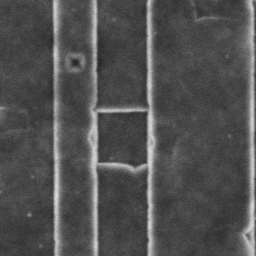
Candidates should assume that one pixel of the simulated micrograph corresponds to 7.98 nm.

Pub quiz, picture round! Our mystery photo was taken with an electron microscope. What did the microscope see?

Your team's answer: wiring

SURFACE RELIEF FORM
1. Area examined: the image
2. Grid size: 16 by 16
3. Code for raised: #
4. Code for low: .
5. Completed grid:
...###...#######
...###...#######
...###...#######
...###...#######
...###...#######
....##...#######
....##...#######
....##...#######
...###...#######
...###...#######
...###...#######
...###...#######
...###...#######
...###...#######
...###...#######
....##...#######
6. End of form